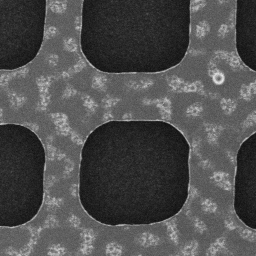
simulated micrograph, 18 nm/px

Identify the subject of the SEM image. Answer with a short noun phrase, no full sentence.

holes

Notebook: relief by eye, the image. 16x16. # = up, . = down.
...##.......###.
...##.......###.
...##.......###.
..###......####.
#######...######
################
################
################
..####.....#####
...##.......###.
...##.......###.
...##.......###.
...##.......###.
..####.....####.
################
################